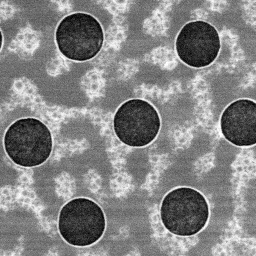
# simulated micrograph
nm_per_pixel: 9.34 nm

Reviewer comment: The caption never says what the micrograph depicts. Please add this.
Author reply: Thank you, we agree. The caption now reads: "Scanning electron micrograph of holes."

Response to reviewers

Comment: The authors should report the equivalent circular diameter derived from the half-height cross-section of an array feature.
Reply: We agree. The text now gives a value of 0.45 um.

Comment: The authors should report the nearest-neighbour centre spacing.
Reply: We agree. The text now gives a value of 0.933 µm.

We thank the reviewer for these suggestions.